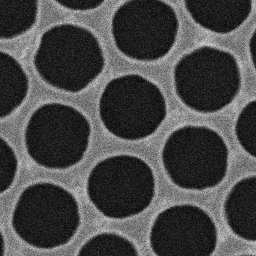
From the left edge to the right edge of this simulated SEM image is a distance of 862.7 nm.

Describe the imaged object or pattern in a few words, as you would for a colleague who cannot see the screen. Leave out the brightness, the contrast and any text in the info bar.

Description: holes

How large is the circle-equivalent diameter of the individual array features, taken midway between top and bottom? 222 nanometers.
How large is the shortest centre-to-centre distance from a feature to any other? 0.267 microns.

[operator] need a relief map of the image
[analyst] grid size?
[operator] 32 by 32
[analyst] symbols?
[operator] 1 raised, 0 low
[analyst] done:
00000110000001100000011000000001
00000111111111000000001100000001
00001111111111000000001100000001
00001100001111000000001111000011
00111000000011000000001111111111
11111000000011000000001111111110
11111000000001100000011100001110
00110000000001111001111000000111
00010000000001111111110000000011
00011000000011100011110000000011
00001100000110000001110000000011
00011111101110000000110000000011
00011111111100000000011000000111
00111000011100000000011100001110
01110000001110000000011111111100
11100000000110000000111111111000
11100000000111000001110000011000
11100000000111110111100000001100
01100000000111111111000000001100
00110000001111101111000000001111
00111000011100000011000000001111
00111111111000000001100000001111
00111111111000000001100000001100
01100000111000000001111000111000
11000000011000000001111111110000
11000000001100000001111111110000
11000000001110000011000000110000
11000000001111111110000000110000
11000000001111111110000000011000
11000000011100011110000000011100
11110000111000000110000000011111
01111111110000000110000000011111